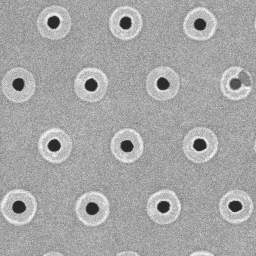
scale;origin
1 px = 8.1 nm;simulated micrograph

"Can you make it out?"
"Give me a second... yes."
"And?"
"a regular array of ring-shaped raised bodies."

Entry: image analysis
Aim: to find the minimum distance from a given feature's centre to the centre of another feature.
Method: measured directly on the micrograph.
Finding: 574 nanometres